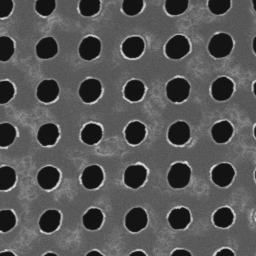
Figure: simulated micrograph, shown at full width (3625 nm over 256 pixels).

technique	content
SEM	a regular array of holes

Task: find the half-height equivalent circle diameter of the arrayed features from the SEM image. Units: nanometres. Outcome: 322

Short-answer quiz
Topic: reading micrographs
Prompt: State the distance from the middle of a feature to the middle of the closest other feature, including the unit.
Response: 606 nanometres